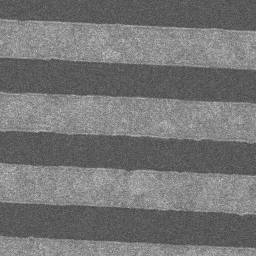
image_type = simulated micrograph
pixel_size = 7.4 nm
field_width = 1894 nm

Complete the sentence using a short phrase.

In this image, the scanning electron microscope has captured one or a few lines or trenches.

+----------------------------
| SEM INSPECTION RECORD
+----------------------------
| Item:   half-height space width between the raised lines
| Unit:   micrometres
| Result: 0.262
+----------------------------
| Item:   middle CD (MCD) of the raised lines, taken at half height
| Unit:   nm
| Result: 276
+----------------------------